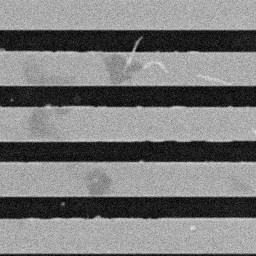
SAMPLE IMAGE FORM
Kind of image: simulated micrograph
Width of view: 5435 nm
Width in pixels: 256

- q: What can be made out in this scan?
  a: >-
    lines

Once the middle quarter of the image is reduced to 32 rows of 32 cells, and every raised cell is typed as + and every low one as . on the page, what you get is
++++++++++++++++++++++++++++++++
++++++++++++++++++++++++++++++++
++++++++++++++++++++++++++++++++
++++++++++++++++++++++++++++++++
++++++++++++++++++++++++++++++++
................................
................................
................................
................................
................................
................................
++++++++++++++++++++++++++++++++
++++++++++++++++++++++++++++++++
++++++++++++++++++++++++++++++++
++++++++++++++++++++++++++++++++
++++++++++++++++++++++++++++++++
++++++++++++++++++++++++++++++++
++++++++++++++++++++++++++++++++
++++++++++++++++++++++++++++++++
................................
................................
................................
................................
................................
................................
++++++++++++++++++++++++++++++++
++++++++++++++++++++++++++++++++
++++++++++++++++++++++++++++++++
++++++++++++++++++++++++++++++++
++++++++++++++++++++++++++++++++
++++++++++++++++++++++++++++++++
++++++++++++++++++++++++++++++++